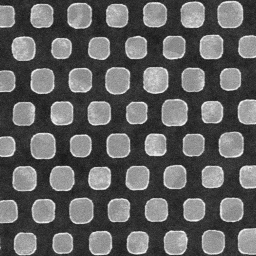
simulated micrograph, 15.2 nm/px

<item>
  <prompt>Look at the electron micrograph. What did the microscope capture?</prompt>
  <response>a regular array of raised bodies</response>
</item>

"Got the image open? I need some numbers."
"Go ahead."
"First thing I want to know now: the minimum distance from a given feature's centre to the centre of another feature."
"565 nm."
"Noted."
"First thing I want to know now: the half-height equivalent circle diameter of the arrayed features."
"370 nm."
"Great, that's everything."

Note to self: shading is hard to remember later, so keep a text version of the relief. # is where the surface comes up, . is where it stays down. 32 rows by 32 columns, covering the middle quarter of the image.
................................
..####.....#####.....####.....##
.######....#####....######....##
.######....#####....######....##
.######....#####....######....##
..#.###....#####....######....##
..####.....#####.....####.....##
................................
................................
#........................#####..
##....#####.....#####....######.
##....######....#####....######.
##....######....#####....######.
##....#####.....#####....######.
##....#####.....####.....#####..
................................
................................
................................
..####.....#####.....#.##.....##
..#####....#####....#####.....##
..#####....#####....##.##.....##
..#####....#####....##..#.....##
..####.....#####.....####.....##
................................
................................
...........................##...
##.....####.....#####....#####..
##....#####.....#####....#####..
##....#####.....#####....#####..
##....#####.....#####....#####..
##.....####.....#####.....####..
................................